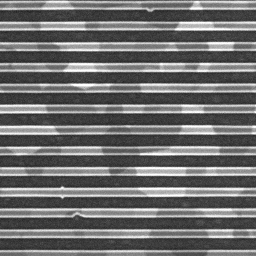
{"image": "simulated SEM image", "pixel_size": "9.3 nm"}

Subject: parallel lines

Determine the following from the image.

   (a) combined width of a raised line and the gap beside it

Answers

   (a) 193 nm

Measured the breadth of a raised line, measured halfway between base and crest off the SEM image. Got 68.6 nm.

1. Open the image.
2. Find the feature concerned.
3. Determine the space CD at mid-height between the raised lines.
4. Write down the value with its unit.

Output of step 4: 129 nm